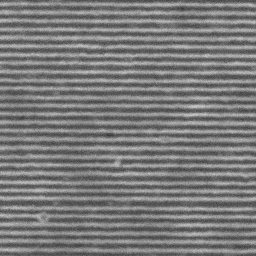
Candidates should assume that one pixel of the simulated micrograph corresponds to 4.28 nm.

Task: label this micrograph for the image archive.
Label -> parallel lines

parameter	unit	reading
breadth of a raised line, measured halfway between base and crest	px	2.76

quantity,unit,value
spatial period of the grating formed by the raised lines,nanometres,36.3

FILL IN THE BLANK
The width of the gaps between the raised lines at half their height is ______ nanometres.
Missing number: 22.5